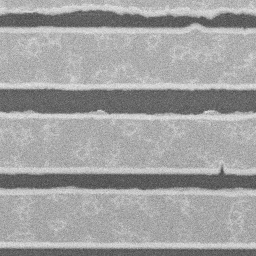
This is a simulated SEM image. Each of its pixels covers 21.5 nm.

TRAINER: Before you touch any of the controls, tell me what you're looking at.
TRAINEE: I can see one or a few lines or trenches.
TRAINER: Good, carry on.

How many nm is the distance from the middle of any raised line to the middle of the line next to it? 1720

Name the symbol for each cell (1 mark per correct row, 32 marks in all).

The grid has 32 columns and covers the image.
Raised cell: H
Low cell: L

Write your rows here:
HHHHHHHHHHHHHHHHHHHHHHHHHHHHHHHH
LLLHLLLLLLLLLLLLLLHHHLLLHHHLLLLL
LLLLLLLLLLLLLLLLLLLLLLLLLLLLLLLL
LLLLLLLLLLLLLLLLLLLLLLLLHLLLLLLL
HHHHHHHHHHHHHHHHHHHHHHHHHHHHHHHH
HHHHHHHHHHHHHHHHHHHHHHHHHHHHHHHH
HHHHHHHHHHHHHHHHHHHHHHHHHHHHHHHH
HHHHHHHHHHHHHHHHHHHHHHHHHHHHHHHH
HHHHHHHHHHHHHHHHHHHHHHHHHHHHHHHH
HHHHHHHHHHHHHHHHHHHHHHHHHHHHHHHH
HHHHHHHHHHHHHHHHHHHHHHHHHHHHHHHH
LLLLLLLLLLLLLLLLLLLLLLLLLLLLLLLL
LLLLLLLLLLLLLLLLLLLLLLLLLLLLLLLL
LLLLLLLLLLLLLLLLLLLLLLLLLLLLLLLL
HLLLLLHLLLLLLLLLLLLLLLLLLLLLLLLL
HHHHHHHHHHHHHHHHHHHHHHHHHHHHHHHH
HHHHHHHHHHHHHHHHHHHHHHHHHHHHHHHH
HHHHHHHHHHHHHHHHHHHHHHHHHHHHHHHH
HHHHHHHHHHHHHHHHHHHHHHHHHHHHHHHH
HHHHHHHHHHHHHHHHHHHHHHHHHHHHHHHH
HHHHHHHHHHHHHHHHHHHHHHHHHHHHHHHH
LLLLLLLLLLLLLLLLLLLLLLLLLLLLLLLL
LLLLLLLLLLLLLLLLLLLLLLLLLLLLLLLL
LLLLLLLLLLLLLLLLLLLLLLLLLLLLLLLL
HHHHHHHHHHHHHHHHHHHHHHHHHHHHHHHH
HHHHHHHHHHHHHHHHHHHHHHHHHHHHHHHH
HHHHHHHHHHHHHHHHHHHHHHHHHHHHHHHH
HHHHHHHHHHHHHHHHHHHHHHHHHHHHHHHH
HHHHHHHHHHHHHHHHHHHHHHHHHHHHHHHH
HHHHHHHHHHHHHHHHHHHHHHHHHHHHHHHH
HHHHHHHHLLHHHHHHHHHHHHHHHHHHHHHH
LLLLLLLLLLLLLLLLLLLLLLLLLLLLLLLL